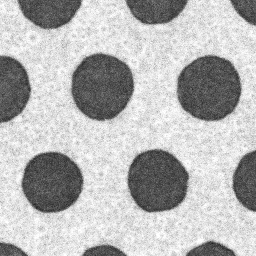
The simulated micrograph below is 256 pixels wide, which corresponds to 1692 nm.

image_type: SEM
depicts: holes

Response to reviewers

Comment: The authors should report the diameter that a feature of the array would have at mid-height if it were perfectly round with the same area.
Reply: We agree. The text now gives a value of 422 nm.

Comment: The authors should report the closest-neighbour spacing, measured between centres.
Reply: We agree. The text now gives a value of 699 nm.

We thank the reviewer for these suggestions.